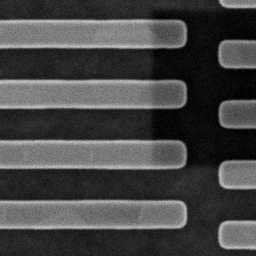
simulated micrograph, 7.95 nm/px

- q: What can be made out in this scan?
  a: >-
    wiring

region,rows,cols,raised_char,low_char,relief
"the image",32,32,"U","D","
DDDDDDDDDDDDDDDDDDDDDDDDDDDDUUUU
DDDDDDDDDDDDDDDDDDDDDDDDDDDDDDDD
DDDDDDDDDDDDDDDDDDDDDDDDDDDDDDDD
UUUUUUUUUUUUUUUUUUUUUUUDDDDDDDDD
UUUUUUUUUUUUUUUUUUUUUUUDDDDDDDDD
UUUUUUUUUUUUUUUUUUUUUUUDDDDDUUUU
DDDDDDDDDDDDDDDDDDDDDDDDDDDUUUUU
DDDDDDDDDDDDDDDDDDDDDDDDDDDUUUUU
DDDDDDDDDDDDDDDDDDDDDDDDDDDDDUUU
DDDDDDDDDDDDDDDDDDDDDDDDDDDDDDDD
UUUUUUUUUUUUUUUUUUUUUUUDDDDDDDDD
UUUUUUUUUUUUUUUUUUUUUUUDDDDDDDDD
UUUUUUUUUUUUUUUUUUUUUUUDDDDDDDDD
DDDDDDDDDDDDDDDDDDDDDDDDDDDUUUUU
DDDDDDDDDDDDDDDDDDDDDDDDDDDUUUUU
DDDDDDDDDDDDDDDDDDDDDDDDDDDDUUUU
DDDDDDDDDDDDDDDDDDDDDDDDDDDDDDDD
DDDDDDDDDDDDDDDDDDDDDDDDDDDDDDDD
UUUUUUUUUUUUUUUUUUUUUUUDDDDDDDDD
UUUUUUUUUUUUUUUUUUUUUUUDDDDDDDDD
UUUUUUUUUUUUUUUUUUUUUUUDDDDDUUUU
DDDDDDDDDDDDDDDDDDDDDDDDDDDUUUUU
DDDDDDDDDDDDDDDDDDDDDDDDDDDUUUUU
DDDDDDDDDDDDDDDDDDDDDDDDDDDDUUUU
DDDDDDDDDDDDDDDDDDDDDDDDDDDDDDDD
UUUUUUUUUUUUUUUUUUUUUUUDDDDDDDDD
UUUUUUUUUUUUUUUUUUUUUUUDDDDDDDDD
UUUUUUUUUUUUUUUUUUUUUUUDDDDDDDDD
DDDDUUUDDDDDDDUUUDDDDDDDDDDUUUUU
DDDDDDDDDDDDDDDDDDDDDDDDDDDUUUUU
DDDDDDDDDDDDDDDDDDDDDDDDDDDDUUUU
DDDDDDDDDDDDDDDDDDDDDDDDDDDDDDDD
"